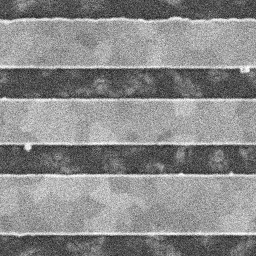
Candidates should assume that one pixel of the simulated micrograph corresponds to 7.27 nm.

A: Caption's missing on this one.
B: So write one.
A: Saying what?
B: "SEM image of one or a few lines or trenches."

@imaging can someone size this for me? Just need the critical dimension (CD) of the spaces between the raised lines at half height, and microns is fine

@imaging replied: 0.231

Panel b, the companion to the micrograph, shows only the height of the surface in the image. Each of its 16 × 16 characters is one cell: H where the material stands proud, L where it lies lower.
LLLLLLLLLLLLLLLL
HHHHHHHHHHHHHHHH
HHHHHHHHHHHHHHHH
HHHHHHHHHHHHHHHH
LLLLLLLLLLLLLLLL
LLLLLLLLLLLLLLLL
HHHHHHHHHHHHHHHH
HHHHHHHHHHHHHHHH
HHHHHHHHHHHHHHHH
LLLLLLLLLLLLLLLL
LLLLLLLLLLLLLLLL
HHHHHHHHHHHHHHHH
HHHHHHHHHHHHHHHH
HHHHHHHHHHHHHHHH
HHHHHHHHHHHHHHHH
LLLLLLLLLLLLLLLL